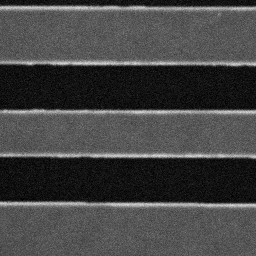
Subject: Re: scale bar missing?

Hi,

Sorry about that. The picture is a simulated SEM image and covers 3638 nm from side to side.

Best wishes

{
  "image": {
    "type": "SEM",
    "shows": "lines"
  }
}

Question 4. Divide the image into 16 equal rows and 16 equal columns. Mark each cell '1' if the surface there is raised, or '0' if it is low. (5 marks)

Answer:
1111111111111111
1111111111111111
1111111111111111
1111111111111111
0000000000000000
0000000000000000
0000000000000000
1111111111111111
1111111111111111
1111111111111111
0000000000000000
0000000000000000
0000000000000000
1111111111111111
1111111111111111
1111111111111111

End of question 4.